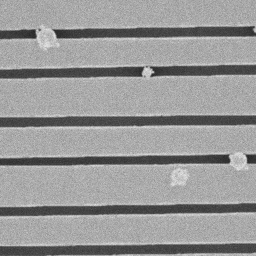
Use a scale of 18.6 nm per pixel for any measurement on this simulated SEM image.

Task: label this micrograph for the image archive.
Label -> lines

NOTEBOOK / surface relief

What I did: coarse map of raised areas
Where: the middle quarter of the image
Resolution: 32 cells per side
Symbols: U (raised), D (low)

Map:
UUUUUUUUUUUUUUUUUUUUUUUUUUUDDDDD
DDDDDDDDDDDDDDDDDDDDUUDDDDDDDDDD
DDDDDDDDDDDDDDDDDDDDUUDDDDDDDDDD
DDDDDDUUUUUUUUUUUUUUUUUUUUUUUUUU
UUUUUUUUUUUUUUUUUUUUUUUUUUUUUUUU
UUUUUUUUUUUUUUUUUUUUUUUUUUUUUUUU
UUUUUUUUUUUUUUUUUUUUUUUUUUUUUUUU
UUUUUUUUUUUUUUUUUUUUUUUUUUUUUUUU
UUUUUUUUUUUUUUUUUUUUUUUUUUUUUUUU
UUUUUUUUUUUUUUUUUUUUUUUUUUUUUUUU
UUUUUUUUUUUUUUUUUUUUUUUUUUUUUUUU
UUUUUUUUUUUUUUUUUUUUUUUUUUUUUUUU
UUUUUUUUUUUUUUUUUUUUUUUUUUUUUUUU
DDDDDDDDDDDDDDDDDDDDDDDDDDDDDDDD
DDDDDDDDDDDDDDDDDDDDDDDDDDDDDDDD
DDDDDDDDDDDDDDDDDDDDDDDDDDDDDDDD
UUUUUUUUUUUUUUUUUUUUUUUUUUUUUUUU
UUUUUUUUUUUUUUUUUUUUUUUUUUUUUUUU
UUUUUUUUUUUUUUUUUUUUUUUUUUUUUUUU
UUUUUUUUUUUUUUUUUUUUUUUUUUUUUUUU
UUUUUUUUUUUUUUUUUUUUUUUUUUUUUUUU
UUUUUUUUUUUUUUUUUUUUUUUUUUUUUUUU
UUUUUUUUUUUUUUUUUUUUUUUUUUUUUUUU
DDDDDDDDDDDDDDDDDDDDDDDDDDDDDDDD
DDDDDDDDDDDDDDDDDDDDDDDDDDDDDDDD
DDUUUUUUUUUUUUUUUUUUUUUUUUUUUUUU
UUUUUUUUUUUUUUUUUUUUUUUUUUUUUUUU
UUUUUUUUUUUUUUUUUUUUUUUUUUUUUUUU
UUUUUUUUUUUUUUUUUUUUUUUUUUUUUUUU
UUUUUUUUUUUUUUUUUUUUUUUUUUUUUUUU
UUUUUUUUUUUUUUUUUUUUUUUUUUUUUUUU
UUUUUUUUUUUUUUUUUUUUUUUUUUUUUUUU